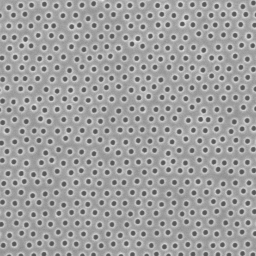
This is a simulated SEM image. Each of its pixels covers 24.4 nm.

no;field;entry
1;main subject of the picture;a regular array of holes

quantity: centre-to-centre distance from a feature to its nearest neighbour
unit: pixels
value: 10.4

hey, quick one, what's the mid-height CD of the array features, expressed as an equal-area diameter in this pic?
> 129 nm